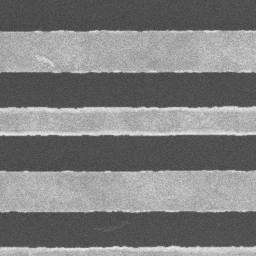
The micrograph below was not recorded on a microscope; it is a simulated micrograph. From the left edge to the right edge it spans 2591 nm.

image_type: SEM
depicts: lines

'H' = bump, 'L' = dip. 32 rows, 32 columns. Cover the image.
LLLLLLLLLLLLLLLLLLLLLLLLLLLLLLLL
LLLLLLLLLLLLLLLLLLLLLLLLLLLLLLLL
LLLLLLLLLLLLLLLLLLLLLLLLLLLLLLLL
LLLLLLLLLLLLLLLLLLLLLLLLLLLLLLLL
HHHHHHHHHHHHHHHHHHHHHHHHHHHHHHHH
HHHHHHHHHHHHHHHHHHHHHHHHHHHHHHHH
HHHHHHHHHHHHHHHHHHHHHHHHHHHHHHHH
HHHHHHHHHHHHHHHHHHHHHHHHHHHHHHHH
HHHHHHHHHHHHHHHHHHHHHHHHHHHHHHHH
LLLLLLLLLLLLLLLLLLLLLLLLLLLLLLLL
LLLLLLLLLLLLLLLLLLLLLLLLLLLLLLLL
LLLLLLLLLLLLLLLLLLLLLLLLLLLLLLLL
LLLLLLLLLLLLLLLLLLLLLLLLLLLLLLLL
LLLLLLLLLLLLLLLLLLLLLLLLLLLLLLLL
HHHHHHHHHHHHHHHHHHHHHHHHHHHHHHHH
HHHHHHHHHHHHHHHHHHHHHHHHHHHHHHHH
HHHHHHHHHHHHHHHHHHHHHHHHHHHHHHHH
LLLLLLLLLLLLLLLLLLLLLLLLLLLLLLLL
LLLLLLLLLLLLLLLLLLLLLLLLLLLLLLLL
LLLLLLLLLLLLLLLLLLLLLLLLLLLLLLLL
LLLLLLLLLLLLLLLLLLLLLLLLLLLLLLLL
HLLHLLLHHHHLLHLLLHHLHHHHHHHHHHHH
HHHHHHHHHHHHHHHHHHHHHHHHHHHHHHHH
HHHHHHHHHHHHHHHHHHHHHHHHHHHHHHHH
HHHHHHHHHHHHHHHHHHHHHHHHHHHHHHHH
HHHHHHHHHHHHHHHHHHHHHHHHHHHHHHHH
LLLLLLLLLLLLLLLLLLLLLLLLLLLLLLLL
LLLLLLLLLLLLLLLLLLLLLLLLLLLLLLLL
LLLLLLLLLLLLLLLLLLLLLLLLLLLLLLLL
LLLLLLLLLLLLLLLLLLLLLLLLLLLLLLLL
LLLLLLLLLLLLLLLLLLLLLLLLLLLLLLLL
HHHHHHHHHHHHHHHHHHHHHHHHHHHHHHHH